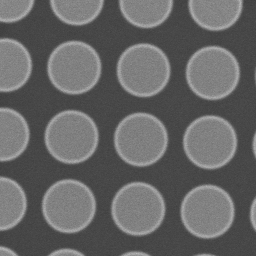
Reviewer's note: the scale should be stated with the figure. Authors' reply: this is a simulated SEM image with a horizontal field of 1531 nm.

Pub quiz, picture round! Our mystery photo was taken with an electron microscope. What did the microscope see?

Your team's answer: an array of small figures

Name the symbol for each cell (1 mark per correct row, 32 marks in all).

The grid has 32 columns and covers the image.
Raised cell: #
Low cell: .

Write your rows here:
####..#######..######...######..
####...#####...######...######..
##......####....#####...######..
.........................###....
................................
###.....###.....................
###....#####....####.....####...
####..######...######...#####...
####..#######..######..#######..
####..######...######..#######..
###....#####...######...######..
........###.....####....#####...
................................
................................
###....####.....###.......#.....
###...######...#####....#####...
####..######..#######..######...
####..######..#######..#######..
###...######..#######..#######..
##.....####....#####...######...
................###.....####....
................................
##......#.......................
###...#####....####.....####....
###...######..######...######...
###..#######..#######..######...
###..#######..#######..######..#
###...#####...######...######..#
#......####....#####...######...
........................###.....
................................
##.....###......................